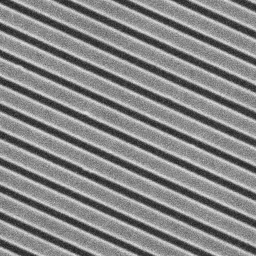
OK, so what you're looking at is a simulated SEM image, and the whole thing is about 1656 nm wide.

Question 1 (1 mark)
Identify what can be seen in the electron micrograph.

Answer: parallel lines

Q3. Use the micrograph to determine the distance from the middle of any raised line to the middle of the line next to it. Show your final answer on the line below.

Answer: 0.159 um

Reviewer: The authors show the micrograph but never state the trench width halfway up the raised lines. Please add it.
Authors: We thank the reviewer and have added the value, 57.4 nm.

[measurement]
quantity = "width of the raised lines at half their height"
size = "0.103 um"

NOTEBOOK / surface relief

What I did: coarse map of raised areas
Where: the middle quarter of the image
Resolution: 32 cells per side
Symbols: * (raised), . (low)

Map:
***.....**********.....*********
*****......*********.....*******
*******......*********......****
*********......*********......**
..**********.....*********......
....**********.....**********...
**.....*********.....**********.
****.....*********......********
******.....*********......******
********.....*********......****
.*********.....**********.....**
...**********.....*********.....
......*********.....*********...
**.....**********.....*********.
****......*********.....********
******......*********.....******
*********.....*********.....****
.**********.....**********.....*
....*********.....**********....
......*********......*********..
**......*********......*********
*****.....*********......*******
*******.....**********.....*****
*********......*********.....***
..*********......*********......
....*********......*********....
*.....**********.....*********..
***.....**********.....*********
*****......*********.....*******
*******......*********......****
*********......*********......**
..**********.....*********......